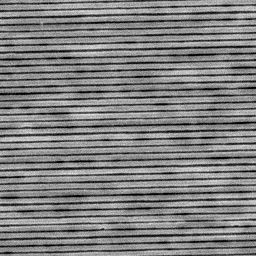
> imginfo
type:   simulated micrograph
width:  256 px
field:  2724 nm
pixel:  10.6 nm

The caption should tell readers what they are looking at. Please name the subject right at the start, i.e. parallel lines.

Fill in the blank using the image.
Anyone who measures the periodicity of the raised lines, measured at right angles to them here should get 6.92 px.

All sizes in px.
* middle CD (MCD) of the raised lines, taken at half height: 4.62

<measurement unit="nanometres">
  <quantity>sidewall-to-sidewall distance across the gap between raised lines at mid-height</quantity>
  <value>19.9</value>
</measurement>